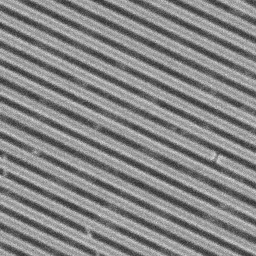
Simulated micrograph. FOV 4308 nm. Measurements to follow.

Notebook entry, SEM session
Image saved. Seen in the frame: parallel lines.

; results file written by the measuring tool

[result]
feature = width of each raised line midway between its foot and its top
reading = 127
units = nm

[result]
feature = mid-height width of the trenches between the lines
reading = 0.144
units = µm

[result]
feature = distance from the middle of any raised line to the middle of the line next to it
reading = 16.4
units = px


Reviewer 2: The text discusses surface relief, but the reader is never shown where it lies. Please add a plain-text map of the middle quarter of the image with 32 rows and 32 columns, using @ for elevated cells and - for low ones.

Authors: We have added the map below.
@@------@@@------@@@@-----@@@@@-
@@@@------@@@@-----@@@@------@@@
--@@@@------@@@@-----@@@@------@
----@@@@------@@@@-----@@@@-----
@-----@@@@------@@@@-----@@@@---
@@@-----@@@@------@@@@-----@@@@-
-@@@@-----@@@@------@@@@-----@@@
---@@@@-----@@@@------@@@@-----@
-----@@@@-----@@@@@-----@@@@----
@@-----@@@@------@@@@-----@@@@--
@@@@-----@@@@@-----@@@@-----@@@@
--@@@@------@@@@-----@@@@-----@@
----@@@@------@@@@-----@@@@-----
@-----@@@@------@@@@-----@@@@---
@@@-----@@@@------@@@@-----@@@@-
-@@@@-----@@@@------@@@@-----@@@
---@@@@-----@@@@------@@@@-----@
-----@@@@-----@@@@------@@@@----
@@-----@@@@-----@@@@------@@@@--
@@@@-----@@@@-----@@@@------@@@@
--@@@@-----@@@@-----@@@@------@@
----@@@@-----@@@@-----@@@@@-----
@-----@@@@-----@@@@------@@@@---
@@@-----@@@@-----@@@@@-----@@@@-
-@@@@-----@@@@------@@@@-----@@@
---@@@@-----@@@@------@@@@-----@
-----@@@@-----@@@@------@@@@----
@------@@@@-----@@@@------@@@@--
@@@------@@@@-----@@@@------@@@@
-@@@@------@@@@-----@@@@------@@
---@@@@------@@@@-----@@@@------
------@@@@-----@@@@-----@@@@----